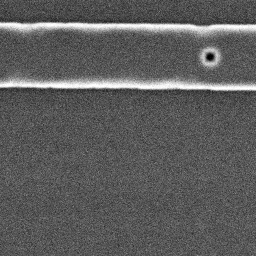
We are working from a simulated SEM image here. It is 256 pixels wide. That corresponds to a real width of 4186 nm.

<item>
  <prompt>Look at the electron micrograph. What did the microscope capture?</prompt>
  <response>wiring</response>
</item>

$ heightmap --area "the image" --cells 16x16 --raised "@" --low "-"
----------------
@---------------
@@@@@@@@@@@@@@@@
@@@@@@@@@@@@@@@@
@@@@@@@@@@@@@@@@
------------@@@@
----------------
----------------
----------------
----------------
----------------
----------------
----------------
----------------
----------------
----------------